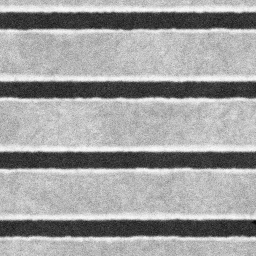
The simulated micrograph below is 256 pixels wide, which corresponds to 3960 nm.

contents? lines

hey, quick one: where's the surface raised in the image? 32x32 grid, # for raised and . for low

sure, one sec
################################
................................
................................
................................
################################
################################
################################
################################
################################
################################
................................
................................
################################
################################
################################
################################
################################
################################
################################
................................
................................
################################
################################
################################
################################
################################
################################
................................
................................
................................
################################
################################